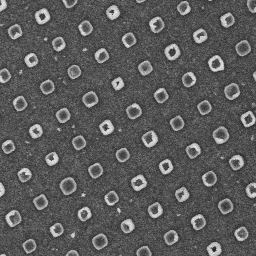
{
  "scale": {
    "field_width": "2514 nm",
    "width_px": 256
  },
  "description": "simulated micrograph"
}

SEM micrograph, a regular array of raised bodies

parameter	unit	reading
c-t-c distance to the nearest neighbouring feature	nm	309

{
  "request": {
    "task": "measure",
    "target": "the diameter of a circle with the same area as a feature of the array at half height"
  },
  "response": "132 nm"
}